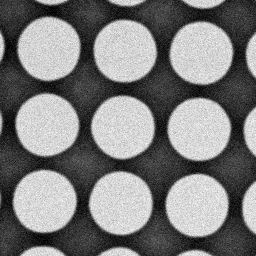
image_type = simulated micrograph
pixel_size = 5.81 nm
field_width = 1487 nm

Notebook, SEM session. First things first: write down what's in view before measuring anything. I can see an array of small figures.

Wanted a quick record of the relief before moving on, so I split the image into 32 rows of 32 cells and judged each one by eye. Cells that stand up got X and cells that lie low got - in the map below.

------X--------XX-------XXX-----
--------------------------------
-----XXX------------------------
---XXXXXX----XXXXX-----XXXX-----
---XXXXXXX--XXXXXXX---XXXXXX----
--XXXXXXXX--XXXXXXX---XXXXXXX--X
--XXXXXXXX--XXXXXXXX-XXXXXXXX--X
---XXXXXXX--XXXXXXX--XXXXXXXX--X
---XXXXXX---XXXXXXX---XXXXXXX--X
----XXXX-----XXXXX-----XXXXX----
--------------------------------
--------------------------------
----XXXX-----XXXX-------XX------
---XXXXXX---XXXXXX----XXXXXX----
--XXXXXXXX--XXXXXXX--XXXXXXX---X
--XXXXXXXX-XXXXXXXX--XXXXXXXX--X
--XXXXXXXX--XXXXXXX--XXXXXXXX--X
---XXXXXX---XXXXXXX--XXXXXXXX--X
---XXXXX-----XXXXX----XXXXXX---X
--------------XXX------XXXX-----
--------------------------------
----XXX-------------------------
---XXXXX-----XXXXX----XXXXX-----
--XXXXXXX---XXXXXXX--XXXXXXX---X
--XXXXXXX--XXXXXXXX--XXXXXXX---X
--XXXXXXXX-XXXXXXXX--XXXXXXX--XX
--XXXXXXX--XXXXXXXX--XXXXXXX--XX
--XXXXXXX---XXXXXX---XXXXXXX---X
----XXXX-----XXXXX----XXXXX----X
------------------------X-------
--------------------------------
---XXXXX-----XXXX------XXX------